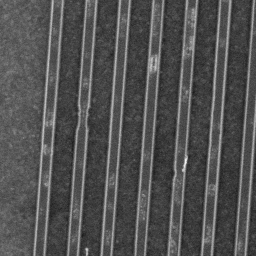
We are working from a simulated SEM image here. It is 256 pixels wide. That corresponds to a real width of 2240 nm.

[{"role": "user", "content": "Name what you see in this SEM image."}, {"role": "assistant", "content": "parallel lines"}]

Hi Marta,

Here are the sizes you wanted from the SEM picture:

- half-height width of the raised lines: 9.22 pixels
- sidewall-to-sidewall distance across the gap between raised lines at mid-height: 213 nanometers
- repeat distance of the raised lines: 292 nm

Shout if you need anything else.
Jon